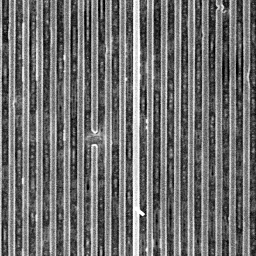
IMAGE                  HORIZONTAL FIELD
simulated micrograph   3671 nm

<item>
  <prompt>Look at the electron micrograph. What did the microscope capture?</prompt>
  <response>parallel lines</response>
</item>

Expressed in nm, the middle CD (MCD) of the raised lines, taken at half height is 84.2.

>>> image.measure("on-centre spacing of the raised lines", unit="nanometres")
198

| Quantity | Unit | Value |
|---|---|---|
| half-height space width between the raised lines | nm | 113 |